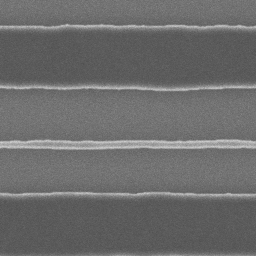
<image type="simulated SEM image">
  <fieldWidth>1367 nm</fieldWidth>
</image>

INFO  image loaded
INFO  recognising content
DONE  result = lines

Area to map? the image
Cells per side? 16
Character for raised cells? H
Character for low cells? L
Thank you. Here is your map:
LLLLLLLLLLLLLLLL
LLLLLLLLLLLLLLLL
HHHHHHHHHHHHHHHH
HHHHHHHHHHHHHHHH
HHHHHHHHHHHHHHHH
LHHHHHHHHHHHHHLL
LLLLLLLLLLLLLLLL
LLLLLLLLLLLLLLLL
LLLLLLLLLLLLLLLL
LLLLLLLLLLLLLLLL
LLLLLLLLLLLLLLLL
LLLLLLLLLLLLLLLL
HHHHHHHHHHHHHHHH
HHHHHHHHHHHHHHHH
HHHHHHHHHHHHHHHH
HHHHHHHHHHHHHHHH